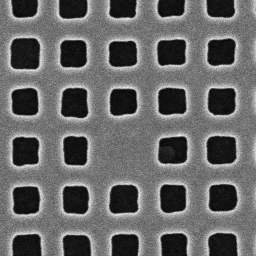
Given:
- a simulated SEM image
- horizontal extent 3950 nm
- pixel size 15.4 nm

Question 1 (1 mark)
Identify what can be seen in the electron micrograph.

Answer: a regular array of holes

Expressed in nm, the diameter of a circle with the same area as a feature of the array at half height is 463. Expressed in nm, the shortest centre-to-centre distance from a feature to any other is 744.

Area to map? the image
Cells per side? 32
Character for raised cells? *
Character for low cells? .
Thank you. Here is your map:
*....**....***...***...***...***
**...**....***...***...***...***
********************************
********************************
********************************
*....***...***...***...***...***
*....***...***...***...***...***
*....**....***...***...***...***
**...***************************
********************************
********************************
**...***...***...***...***...***
*....***...***...***...***...***
*....***...***...***...***...***
********...*********************
********************************
********************************
**...***...*********...***...***
*....***...*********...***....**
*....***...*********...***....**
**..****...***************...***
********************************
********************************
**...***...***...***...***...***
**...***...***...***...***....**
**...***...***...***...***....**
**...***...***...***..**********
********************************
********************************
**...***...***...***...***...***
*....***...***...***...***....**
*....***...***...***...***....**